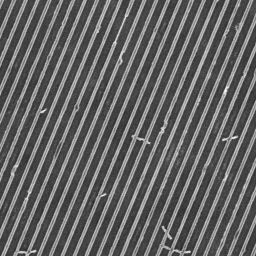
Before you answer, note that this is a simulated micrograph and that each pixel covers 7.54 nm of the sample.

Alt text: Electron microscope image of parallel lines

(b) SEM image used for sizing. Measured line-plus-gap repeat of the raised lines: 82.7 nm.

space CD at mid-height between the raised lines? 59.2 nanometers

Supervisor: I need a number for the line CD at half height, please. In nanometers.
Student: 21.8